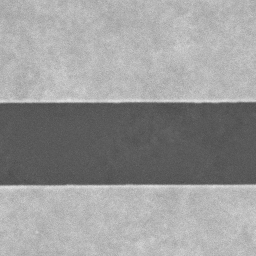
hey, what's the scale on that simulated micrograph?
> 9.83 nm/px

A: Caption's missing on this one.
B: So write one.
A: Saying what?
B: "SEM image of wiring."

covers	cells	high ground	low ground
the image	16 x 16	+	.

++++++++++++++++
++++++++++++++++
++++++++++++++++
++++++++++++++++
++++++++++++++++
++++++++++++++++
................
................
................
................
................
................
++++++++++++++++
++++++++++++++++
++++++++++++++++
++++++++++++++++